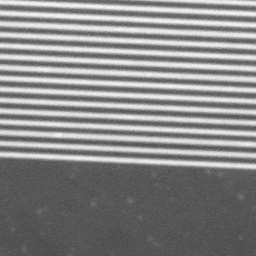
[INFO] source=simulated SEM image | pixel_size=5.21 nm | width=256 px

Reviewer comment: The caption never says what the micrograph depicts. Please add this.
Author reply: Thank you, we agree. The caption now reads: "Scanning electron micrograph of parallel lines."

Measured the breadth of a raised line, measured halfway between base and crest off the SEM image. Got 19.5 nm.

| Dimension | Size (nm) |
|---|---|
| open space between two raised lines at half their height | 33.8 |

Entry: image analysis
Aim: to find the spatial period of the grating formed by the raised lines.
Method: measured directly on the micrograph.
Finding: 0.0566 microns